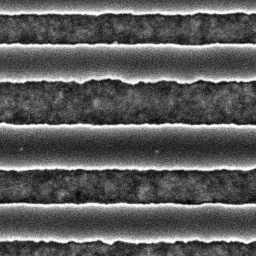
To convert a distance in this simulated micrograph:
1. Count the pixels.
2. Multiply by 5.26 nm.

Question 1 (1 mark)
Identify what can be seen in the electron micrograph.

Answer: lines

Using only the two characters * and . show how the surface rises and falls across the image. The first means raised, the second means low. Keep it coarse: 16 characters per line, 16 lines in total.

****************
................
................
****************
****************
................
................
................
****************
****************
****************
................
................
****************
****************
................